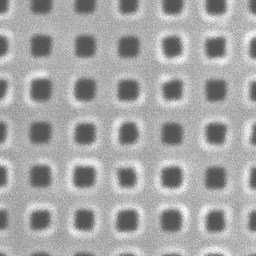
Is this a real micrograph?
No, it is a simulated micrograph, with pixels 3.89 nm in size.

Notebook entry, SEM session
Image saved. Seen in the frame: a regular array of holes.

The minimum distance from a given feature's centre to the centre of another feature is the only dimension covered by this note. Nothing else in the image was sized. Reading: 167 nm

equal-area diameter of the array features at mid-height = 0.093 micrometres